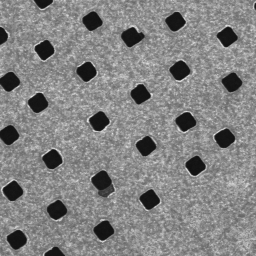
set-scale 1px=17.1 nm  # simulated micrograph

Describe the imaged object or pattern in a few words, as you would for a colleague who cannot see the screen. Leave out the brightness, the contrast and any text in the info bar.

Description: a regular array of holes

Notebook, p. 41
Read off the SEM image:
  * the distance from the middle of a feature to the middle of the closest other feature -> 0.805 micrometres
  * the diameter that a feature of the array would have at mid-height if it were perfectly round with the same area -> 0.323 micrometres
